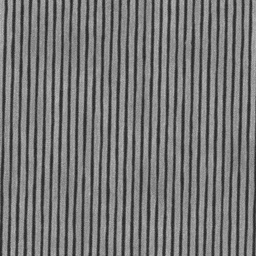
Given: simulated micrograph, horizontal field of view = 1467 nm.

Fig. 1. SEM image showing parallel lines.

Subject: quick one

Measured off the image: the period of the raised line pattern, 8.17 pixels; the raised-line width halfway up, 30.1 nm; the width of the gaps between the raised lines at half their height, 15 nm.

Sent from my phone